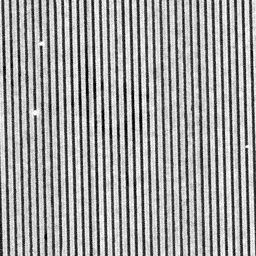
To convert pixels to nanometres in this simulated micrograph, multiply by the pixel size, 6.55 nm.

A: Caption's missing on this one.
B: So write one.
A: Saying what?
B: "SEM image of parallel lines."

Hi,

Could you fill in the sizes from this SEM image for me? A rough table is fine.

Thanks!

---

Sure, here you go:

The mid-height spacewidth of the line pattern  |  22.1 nanometres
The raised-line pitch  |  0.0492 micrometres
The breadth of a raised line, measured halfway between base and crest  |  0.0221 µm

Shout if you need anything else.